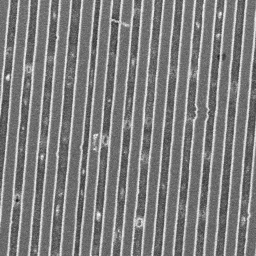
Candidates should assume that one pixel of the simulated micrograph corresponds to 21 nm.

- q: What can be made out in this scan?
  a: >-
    parallel lines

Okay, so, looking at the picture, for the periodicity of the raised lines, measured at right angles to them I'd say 432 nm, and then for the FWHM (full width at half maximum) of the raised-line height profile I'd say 0.222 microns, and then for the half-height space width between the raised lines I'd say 201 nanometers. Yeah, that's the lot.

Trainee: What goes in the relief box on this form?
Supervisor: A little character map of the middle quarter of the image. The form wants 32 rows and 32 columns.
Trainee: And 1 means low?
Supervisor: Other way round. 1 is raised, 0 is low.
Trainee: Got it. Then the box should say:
00011100111001110011100111000110
00011100111001110011100111000110
00011100111001110011100111001110
00011100110001110011100111001110
00011100110001110011100111001110
00011100110001110011100111001110
00011100110001110011100111001110
00011101110011100011000111001110
00011101110011100011000111001110
00111001110011100111000110001110
00111001110011100011000110001100
00111001110011100111001110001100
00111001110011100111001110001100
00111001110011100111001110001100
00111001110011100111001110011100
00111001100011100111001110011100
00111001100011100111001110011100
00111001100011100111001110011100
00111001100011000111001110011100
00111011100111000110001100011100
00110011100111000110001100011100
01110011100111000110001100011100
01110011100111001110001100011000
01110011100111001110011100011000
01110011100111001110011100011000
01110011100111001110011100011000
01110011100111001110011100111001
01110011000111001110011100111001
01110011000111001110011100111000
01110011000111001110011100111001
11110111000110001100011100111001
11110111001110001110011000111001